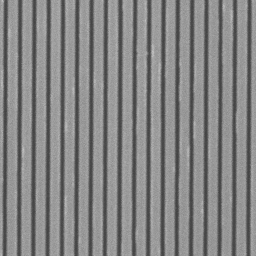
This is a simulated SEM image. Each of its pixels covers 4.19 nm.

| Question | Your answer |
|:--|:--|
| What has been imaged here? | parallel lines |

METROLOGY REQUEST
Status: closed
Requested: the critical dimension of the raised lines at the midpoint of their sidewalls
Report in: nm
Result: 43.5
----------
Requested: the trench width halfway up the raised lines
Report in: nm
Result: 19.9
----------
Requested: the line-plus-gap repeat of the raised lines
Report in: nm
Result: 60